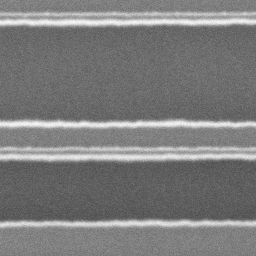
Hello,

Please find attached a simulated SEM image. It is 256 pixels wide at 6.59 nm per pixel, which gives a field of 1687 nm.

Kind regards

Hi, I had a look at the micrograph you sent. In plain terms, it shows lines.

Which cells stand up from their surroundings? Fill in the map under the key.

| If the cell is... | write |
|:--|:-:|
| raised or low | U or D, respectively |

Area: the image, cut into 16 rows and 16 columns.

UUUUUUUUUUUUUUUU
DDDDDDDDDDDDDDDD
DDDDDDDDDDDDDDDD
DDDDDDDDDDDDDDDD
DDDDDDDDDDDDDDDD
DDDDDDDDDDDDDDDD
DDDDDDDDDDDDDDDD
DDDDDDDDDDDDDDDD
UUUUUUUUUUUUUUUU
UUUUUUUUUUUUUUUU
DDDDDDDDDDDDDDDD
DDDDDDDDDDDDDDDD
DDDDDDDDDDDDDDDD
DDDDDDDDDDDDDDDD
UUUUUUUUUUUUUUUU
UUUUUUUUUUUUUUUU